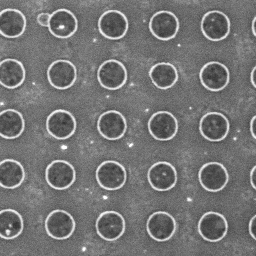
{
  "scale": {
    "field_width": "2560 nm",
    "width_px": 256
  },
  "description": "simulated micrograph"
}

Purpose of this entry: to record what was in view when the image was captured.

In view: a regular array of raised bodies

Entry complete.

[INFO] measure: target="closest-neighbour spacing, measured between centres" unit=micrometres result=0.502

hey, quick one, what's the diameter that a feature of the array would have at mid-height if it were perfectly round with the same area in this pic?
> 283 nanometres